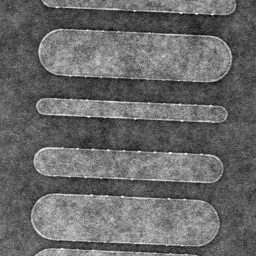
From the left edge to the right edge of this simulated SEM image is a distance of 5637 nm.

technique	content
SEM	groups of lines, slits or small figures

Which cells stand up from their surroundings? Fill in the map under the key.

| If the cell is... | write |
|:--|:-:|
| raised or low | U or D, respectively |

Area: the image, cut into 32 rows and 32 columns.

DDDDDDUUUUUUUUUUUUUUUUUUUUUUUDDD
DDDDDDDDDDDDDDDDDDDDDUUUUUUUUDDD
DDDDDDDDDDDDDDDDDDDDDDDDDDDDDDDD
DDDDDDDDDDDDDDDDDDDDDDDDDDDDDDDD
DDDDDDUUUUUUUUUUUUUUUUUUUDDDDDDD
DDDDDUUUUUUUUUUUUUUUUUUUUUUUDDDD
DDDDDUUUUUUUUUUUUUUUUUUUUUUUUDDD
DDDDDUUUUUUUUUUUUUUUUUUUUUUUUDDD
DDDDDDUUUUUUUUUUUUUUUUUUUUUUUDDD
DDDDDDDDDDDUUUUUUUUUUUUUUUUUDDDD
DDDDDDDDDDDDDDDDDDDDDDDDDDDDDDDD
DDDDDDDDDDDDDDDDDDDDDDDDDDDDDDDD
DDDDDUUUDDDDDDDDDDDDDDDDDDDDDDDD
DDDDDUUUUUUUUUUUUUUUUUUUUUUUDDDD
DDDDDDDDDDDDUUUUUUUUUUUUUUUUDDDD
DDDDDDDDDDDDDDDDDDDDDDDDDDDDDDDD
DDDDDDDDDDDDDDDDDDDDDDDDDDDDDDDD
DDDDDDDDDDDDDDDDDDDDDDDDDDDDDDDD
DDDDDDDDDDDDDDDDDDDDDDDDDDDDDDDD
DDDDUUUUUUUUUUUUUUUUUUUUUUUDDDDD
DDDDUUUUUUUUUUUUUUUUUUUUUUUUDDDD
DDDDDUUUUUUUUUUUUUUUUUUUUUUUDDDD
DDDDDDDDDDDDDDDDDDDDUUUUUUUDDDDD
DDDDDDDDDDDDDDDDDDDDDDDDDDDDDDDD
DDDDDDUUUUUUUDDDDDDDDDDDDDDDDDDD
DDDDUUUUUUUUUUUUUUUUUUUUUUDDDDDD
DDDDUUUUUUUUUUUUUUUUUUUUUUUDDDDD
DDDDUUUUUUUUUUUUUUUUUUUUUUUDDDDD
DDDDUUUUUUUUUUUUUUUUUUUUUUUDDDDD
DDDDDUUUUUUUUUUUUUUUUUUUUUUDDDDD
DDDDDDDDDDDDDDDDDDDDUUUUUUDDDDDD
DDDDDUUUUUUUUUDDDDDDDDDDDDDDDDDD